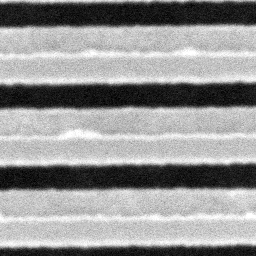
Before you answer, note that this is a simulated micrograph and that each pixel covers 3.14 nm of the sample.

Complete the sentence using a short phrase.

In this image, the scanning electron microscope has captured lines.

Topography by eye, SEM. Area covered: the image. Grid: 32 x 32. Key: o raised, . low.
................................
................................
................................
oooooooooooooooooooooooooooooooo
oooooooooooooooooooooooooooooooo
oooooooooooooooooooooooooooooooo
oooooooooooooooooooooooooooooooo
oooooooooooooooooooooooooooooooo
oooooooooooooooooooooooooooooooo
oooooooooooooooooooooooooooooooo
................................
................................
................................
..........................o..ooo
oooooooooooooooooooooooooooooooo
oooooooooooooooooooooooooooooooo
oooooooooooooooooooooooooooooooo
oooooooooooooooooooooooooooooooo
oooooooooooooooooooooooooooooooo
oooooooooooooooooooooooooooooooo
ooooooo.o...o...................
................................
................................
................................
oooooooooooooooooooooooooooooooo
oooooooooooooooooooooooooooooooo
oooooooooooooooooooooooooooooooo
oooooooooooooooooooooooooooooooo
oooooooooooooooooooooooooooooooo
oooooooooooooooooooooooooooooooo
ooooooooooooooooooooooooooooo..o
................................